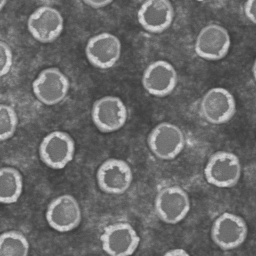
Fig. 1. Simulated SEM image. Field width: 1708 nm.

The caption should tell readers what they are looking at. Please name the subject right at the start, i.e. a regular array of raised bodies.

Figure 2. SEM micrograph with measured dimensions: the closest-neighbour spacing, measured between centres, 418 nm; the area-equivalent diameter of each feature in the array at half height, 223 nm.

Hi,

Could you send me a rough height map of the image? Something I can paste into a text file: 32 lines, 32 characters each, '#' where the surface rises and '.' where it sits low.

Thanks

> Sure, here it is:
...........##.....###..........#
....###..........####..........#
....####.........####..........#
....####..........###.....#.....
....###.....##...........###....
...........####..........####...
#..........####..........###....
#..........###..................
#..................##...........
.....###..........####..........
....####..........####..........
....####...........##.....##....
.....###.....##..........####...
#...........####.........####...
##..........####..........###...
##..........###.................
##.................####.........
......###..........####.........
.....####..........####.........
.....####...........##.....##...
......##.....###..........####..
##..........####..........####..
###.........####..........####..
###..........###.....#..........
##..................###.........
......###...........####........
......####..........###.........
......####...........#.....###..
.......##....###...........####.
###..........####..........####.
###..........####..........###..
###..........###.....##.........